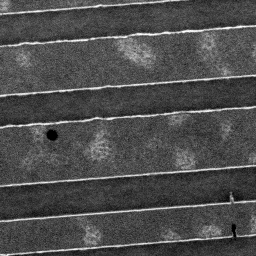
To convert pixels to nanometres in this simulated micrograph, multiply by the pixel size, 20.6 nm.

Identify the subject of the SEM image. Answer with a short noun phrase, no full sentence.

one or a few lines or trenches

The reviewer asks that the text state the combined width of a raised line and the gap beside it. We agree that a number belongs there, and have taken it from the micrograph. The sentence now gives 1720 nanometers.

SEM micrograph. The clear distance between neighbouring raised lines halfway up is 0.668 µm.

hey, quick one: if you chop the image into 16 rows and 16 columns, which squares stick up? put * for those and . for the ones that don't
*****...........
................
.....***********
****************
****************
******..........
................
.....***********
****************
****************
**************..
**..............
................
....************
****************
******..........